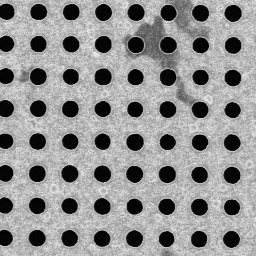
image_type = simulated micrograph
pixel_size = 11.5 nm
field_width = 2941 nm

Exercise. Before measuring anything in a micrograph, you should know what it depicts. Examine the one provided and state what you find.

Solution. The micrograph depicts a regular array of holes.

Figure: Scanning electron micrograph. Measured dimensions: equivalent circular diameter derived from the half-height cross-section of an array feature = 191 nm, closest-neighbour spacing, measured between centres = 368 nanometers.